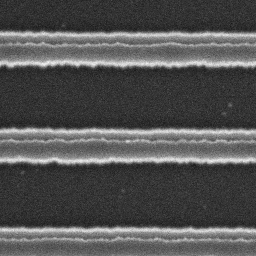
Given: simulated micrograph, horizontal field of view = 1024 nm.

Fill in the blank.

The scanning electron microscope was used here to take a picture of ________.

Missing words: lines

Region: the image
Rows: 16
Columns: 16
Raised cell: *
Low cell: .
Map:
................
................
****************
****************
................
................
................
................
****************
****************
................
................
................
................
****************
****************